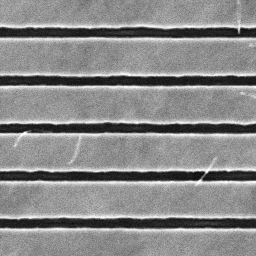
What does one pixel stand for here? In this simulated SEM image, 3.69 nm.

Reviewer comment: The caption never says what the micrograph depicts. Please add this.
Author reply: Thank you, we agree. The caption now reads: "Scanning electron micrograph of lines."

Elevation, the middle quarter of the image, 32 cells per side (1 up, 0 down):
11111111111111111111111111111111
11111111111111111111111111111111
11111111111111111111111111111111
00000000000000000000000000000000
00000000000000000000000000000000
10000100111001100100000000000011
11111111111111111111111111111111
11111111111111111111111111111111
11111111111111111111111111111111
11111111111111111111111111111111
11111111111111111111111111111111
11111111111111111111111111111111
11111111111111111111111111111111
11111111111111111111111111111111
11111111111111111111111111111111
00000000000000000000000000000000
00000000000000000000000000000000
10111000011111111111111100000000
11111111111111111111111111111111
11111111111111111111111111111111
11111111111111111111111111111111
11111111111111111111111111111111
11111111111111111111111111111111
11111111111111111111111111111111
11111111111111111111111111111111
11111111111111111111111111111111
11111111111111111111111111111111
00000000000000000000000000000000
00000000000000000000000000000000
11111111111111111111111111111111
11111111111111111111111111111111
11111111111111111111111111111111